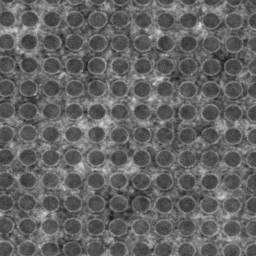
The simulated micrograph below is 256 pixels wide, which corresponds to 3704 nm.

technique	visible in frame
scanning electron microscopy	a regular array of raised bodies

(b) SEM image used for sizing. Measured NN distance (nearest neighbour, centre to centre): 326 nanometres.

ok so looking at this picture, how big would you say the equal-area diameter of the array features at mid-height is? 252 nm